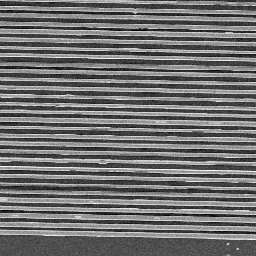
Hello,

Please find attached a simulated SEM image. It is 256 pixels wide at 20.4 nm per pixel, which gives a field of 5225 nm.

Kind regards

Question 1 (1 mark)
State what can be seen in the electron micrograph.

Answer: parallel lines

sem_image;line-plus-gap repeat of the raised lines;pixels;8.01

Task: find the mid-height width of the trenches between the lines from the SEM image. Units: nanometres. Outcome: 81.6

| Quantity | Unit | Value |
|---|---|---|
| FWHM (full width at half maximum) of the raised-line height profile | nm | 79.1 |